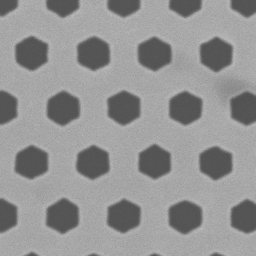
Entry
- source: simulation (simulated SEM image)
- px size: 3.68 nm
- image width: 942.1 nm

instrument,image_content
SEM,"a regular array of holes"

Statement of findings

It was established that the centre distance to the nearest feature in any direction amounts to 0.225 µm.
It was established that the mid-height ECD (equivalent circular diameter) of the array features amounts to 122 nanometres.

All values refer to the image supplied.